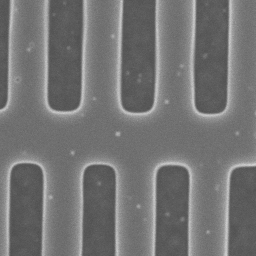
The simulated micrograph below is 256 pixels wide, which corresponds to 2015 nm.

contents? groups of lines, slits or small figures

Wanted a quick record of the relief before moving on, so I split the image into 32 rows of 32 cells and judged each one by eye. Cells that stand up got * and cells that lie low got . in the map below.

.*****.....****.....****.....***
.*****.....****.....****.....***
.*****.....****.....****.....***
.*****.....****.....****.....***
.*****.....****.....****.....***
.*****.....****.....****.....***
.*****....*****.....****.....***
.*****....*****.....****.....***
.*****....*****.....****.....***
.*****....*****.....****.....***
.*****....*****.....****....****
.*****....*****....*****....****
.*****....*****....*****....****
******....*****....*****....****
********************************
********************************
********************************
********************************
********************************
********************************
**..********.********.**********
*....*****....******....*****...
*.....****.....****.....*****...
*.....****.....****.....*****...
*.....****.....****.....*****...
*.....****.....****.....****....
*.....****.....****.....****....
*....*****.....****.....****....
*....*****.....****.....****....
*....*****.....****.....****....
*....*****.....****.....****....
*....*****.....****.....****....